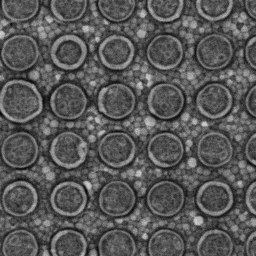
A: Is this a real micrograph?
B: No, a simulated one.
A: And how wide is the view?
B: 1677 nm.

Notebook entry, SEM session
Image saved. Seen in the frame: a regular array of raised bodies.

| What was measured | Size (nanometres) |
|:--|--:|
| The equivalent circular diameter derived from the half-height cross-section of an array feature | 225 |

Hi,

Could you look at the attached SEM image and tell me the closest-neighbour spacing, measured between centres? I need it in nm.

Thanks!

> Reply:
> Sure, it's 317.